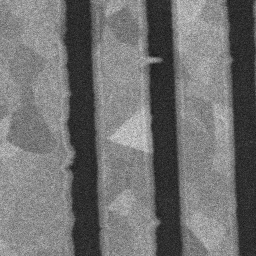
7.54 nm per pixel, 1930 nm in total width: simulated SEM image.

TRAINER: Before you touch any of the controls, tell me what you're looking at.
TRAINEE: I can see one or a few lines or trenches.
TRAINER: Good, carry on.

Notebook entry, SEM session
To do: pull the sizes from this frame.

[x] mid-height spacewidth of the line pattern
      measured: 33.7 pixels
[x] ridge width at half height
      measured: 360 nm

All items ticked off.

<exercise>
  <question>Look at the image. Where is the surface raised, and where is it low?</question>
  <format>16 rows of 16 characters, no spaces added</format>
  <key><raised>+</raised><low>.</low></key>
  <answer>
++++..+++..+++..
++++..+++..+++..
++++..+++..+++..
++++..+++..+++..
++++..+++..+++..
++++..+++..+++..
++++..+++..+++..
++++..+++..+++..
++++..+++..+++..
++++..+++..+++..
++++..+++..+++..
++++..+++..+++..
++++..+++...++..
++++..++++..+++.
++++...++...+++.
++++...++...+++.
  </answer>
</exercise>